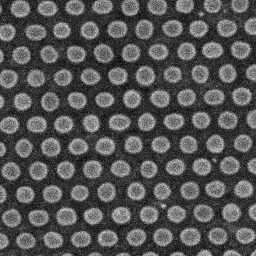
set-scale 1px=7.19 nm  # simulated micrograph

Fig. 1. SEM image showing a regular array of raised bodies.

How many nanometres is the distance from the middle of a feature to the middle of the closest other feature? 190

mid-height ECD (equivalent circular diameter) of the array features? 119 nanometers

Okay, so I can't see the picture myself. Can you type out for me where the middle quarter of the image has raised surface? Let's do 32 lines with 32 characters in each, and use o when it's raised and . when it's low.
................................
......o.....ooo....ooo....ooo...
oo...oooo..oooo...oooo...oooo...
oo...oooo..ooooo..ooooo...ooo...
o....ooo....ooo....ooo..........
................................
................................
..oo.....oo....ooo....oooo...ooo
.oooo...oooo...oooo...oooo...ooo
.oooo...oooo...oooo...oooo...ooo
..ooo....oo.....oo......o.......
................................
................................
o....ooo....oooo...ooo...oooo...
oo...ooo....oooo...oooo..ooooo..
oo...ooo....oooo...ooo....ooo...
o.....oo........................
................................
.................oo....oo.....oo
..ooo....ooo....ooo...oooo...ooo
.ooooo..oooo....ooo...oooo...ooo
..oooo..oooo....ooo....ooo....oo
................................
................................
.............oo.....oo.....oo...
oo...oooo...oooo....ooo...oooo..
oo...oooo...oooo...oooo...oooo..
oo...oooo....ooo....ooo....oo...
o...............................
................................
.........ooo.....oo....ooo....oo
..oooo...oooo...oooo...ooo...ooo